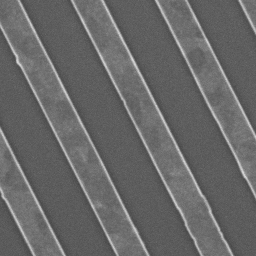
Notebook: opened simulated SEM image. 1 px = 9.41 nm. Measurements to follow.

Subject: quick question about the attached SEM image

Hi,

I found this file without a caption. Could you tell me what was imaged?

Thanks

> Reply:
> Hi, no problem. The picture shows one or a few lines or trenches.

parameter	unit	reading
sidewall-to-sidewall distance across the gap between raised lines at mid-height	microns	0.445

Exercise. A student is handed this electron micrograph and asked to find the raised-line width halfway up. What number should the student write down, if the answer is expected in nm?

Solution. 260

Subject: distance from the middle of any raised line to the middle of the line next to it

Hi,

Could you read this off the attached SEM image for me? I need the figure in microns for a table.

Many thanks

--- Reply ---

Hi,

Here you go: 0.704